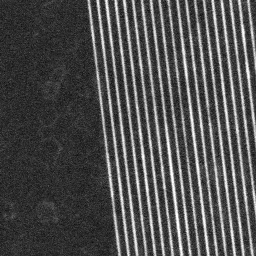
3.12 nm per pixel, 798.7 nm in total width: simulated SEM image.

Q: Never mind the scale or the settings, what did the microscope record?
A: parallel lines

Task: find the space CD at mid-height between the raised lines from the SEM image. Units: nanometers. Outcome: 22.1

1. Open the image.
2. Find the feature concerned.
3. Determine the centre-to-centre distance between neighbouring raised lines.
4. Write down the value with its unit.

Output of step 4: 27.4 nm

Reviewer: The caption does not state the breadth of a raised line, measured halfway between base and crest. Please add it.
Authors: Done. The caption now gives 4.6 nm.